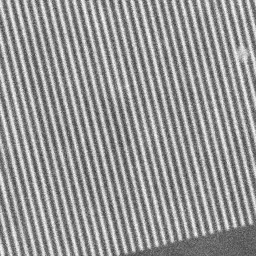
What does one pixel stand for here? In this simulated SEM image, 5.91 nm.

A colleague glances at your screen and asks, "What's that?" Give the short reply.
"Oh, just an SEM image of parallel lines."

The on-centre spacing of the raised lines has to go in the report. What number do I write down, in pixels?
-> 8.04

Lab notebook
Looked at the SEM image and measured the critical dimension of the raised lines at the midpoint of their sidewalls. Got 15.1 nanometres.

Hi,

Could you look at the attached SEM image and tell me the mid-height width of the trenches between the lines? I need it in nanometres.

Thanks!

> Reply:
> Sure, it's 31.6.